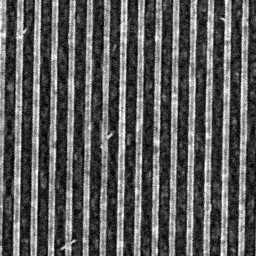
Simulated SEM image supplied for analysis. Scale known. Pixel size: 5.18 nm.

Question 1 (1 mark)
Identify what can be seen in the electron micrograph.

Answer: parallel lines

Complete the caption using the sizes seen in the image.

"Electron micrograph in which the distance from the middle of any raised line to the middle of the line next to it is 89.7 nanometers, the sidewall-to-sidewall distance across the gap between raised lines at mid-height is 65.3 nanometres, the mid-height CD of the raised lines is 0.0252 micrometres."